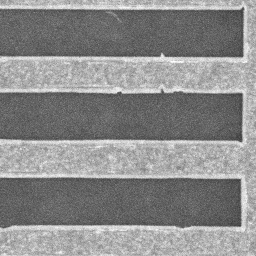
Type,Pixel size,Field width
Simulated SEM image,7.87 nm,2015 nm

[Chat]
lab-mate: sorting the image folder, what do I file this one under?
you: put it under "one or a few lines or trenches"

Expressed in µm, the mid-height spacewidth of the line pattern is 0.398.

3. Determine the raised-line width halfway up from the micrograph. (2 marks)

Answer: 268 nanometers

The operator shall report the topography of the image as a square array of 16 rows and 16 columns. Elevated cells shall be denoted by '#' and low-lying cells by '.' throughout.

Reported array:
...............#
...............#
...............#
...............#
################
################
...............#
...............#
...............#
################
################
...............#
...............#
...............#
################
################